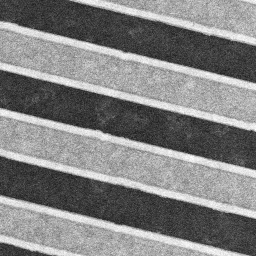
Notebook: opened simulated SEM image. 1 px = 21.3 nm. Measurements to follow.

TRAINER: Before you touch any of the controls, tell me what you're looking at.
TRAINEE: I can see one or a few lines or trenches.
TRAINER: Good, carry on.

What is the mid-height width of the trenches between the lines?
961 nanometres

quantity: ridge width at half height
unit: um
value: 0.838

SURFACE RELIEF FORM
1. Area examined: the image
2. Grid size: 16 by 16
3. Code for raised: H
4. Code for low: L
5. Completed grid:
LLLLLLLHHHHHHHHH
LLLLLLLLLLLLHHHH
HHHHLLLLLLLLLLLL
HHHHHHHHLLLLLLLL
LLHHHHHHHHHHLLLL
LLLLLLHHHHHHHHHH
LLLLLLLLLLHHHHHH
HHLLLLLLLLLLLLHH
HHHHHHLLLLLLLLLL
HHHHHHHHHHLLLLLL
LLLLHHHHHHHHHHHL
LLLLLLLLHHHHHHHH
LLLLLLLLLLLLHHHH
HHHHLLLLLLLLLLLL
HHHHHHHHLLLLLLLL
LLHHHHHHHHHHHLLL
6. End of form